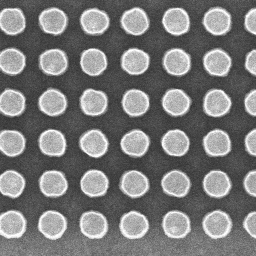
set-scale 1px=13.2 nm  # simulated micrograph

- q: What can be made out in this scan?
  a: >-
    a regular array of raised bodies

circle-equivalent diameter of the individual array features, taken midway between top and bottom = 27 pixels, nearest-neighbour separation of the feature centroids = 0.533 um